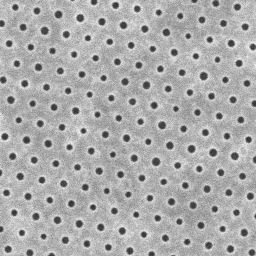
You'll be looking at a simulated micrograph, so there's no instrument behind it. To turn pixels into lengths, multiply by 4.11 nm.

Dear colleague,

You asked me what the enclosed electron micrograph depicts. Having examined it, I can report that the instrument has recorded a regular array of holes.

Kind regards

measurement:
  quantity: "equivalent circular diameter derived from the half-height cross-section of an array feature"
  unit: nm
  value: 31.4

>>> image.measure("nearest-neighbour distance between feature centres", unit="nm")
87.6